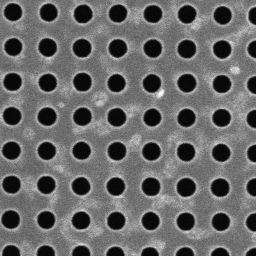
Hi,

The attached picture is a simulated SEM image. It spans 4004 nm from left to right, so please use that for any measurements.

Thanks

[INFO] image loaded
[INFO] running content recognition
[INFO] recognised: a regular array of holes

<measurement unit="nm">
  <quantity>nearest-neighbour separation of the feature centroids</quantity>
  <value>533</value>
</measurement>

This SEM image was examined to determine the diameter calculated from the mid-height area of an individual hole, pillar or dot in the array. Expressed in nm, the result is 293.